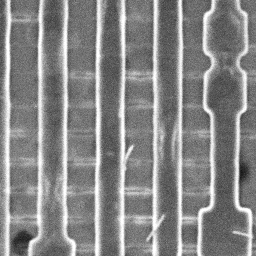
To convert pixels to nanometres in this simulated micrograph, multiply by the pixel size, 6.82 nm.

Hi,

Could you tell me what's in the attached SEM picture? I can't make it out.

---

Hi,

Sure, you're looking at wiring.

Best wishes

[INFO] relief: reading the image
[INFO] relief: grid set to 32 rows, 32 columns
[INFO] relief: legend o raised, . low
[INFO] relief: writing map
o....ooo....ooo....oooo....ooo..
o....ooo....ooo....oooo...oooo..
o....ooo....ooo....oooo...ooooo.
o....ooo....ooo....oooo...ooooo.
o....ooo....ooo....oooo...ooooo.
o....ooo....ooo....oooo...ooooo.
o....ooo....ooo....oooo...oooo..
o....ooo....ooo....oooo....ooo..
o....ooo....ooo....oooo....ooo..
o....ooo....ooo....oooo...oooo..
o....ooo....ooo....oooo...ooooo.
o....ooo....ooo....oooo...ooooo.
o....ooo....ooo.....ooo...ooooo.
o....ooo....ooo....oooo...ooooo.
o....ooo....ooo....oooo...oooo..
o....ooo....ooo....oooo...oooo..
o....ooo....ooo....oooo...oooo..
o....ooo....ooo....ooo....oooo..
o....ooo....ooo....ooo....oooo..
o....ooo....ooo.....oo....oooo..
o....ooo....ooo....ooo....oooo..
o....ooo....ooo....oooo....ooo..
o....ooo....ooo....oooo....ooo..
o....ooo....ooo....oooo....ooo..
o....ooo....ooo....oooo....ooo..
o....ooo....ooo....oooo...oooo..
o....ooo....ooo....oooo..oooooo.
o....ooo....ooo....oooo..oooooo.
o....ooo....ooo....oooo..oooooo.
o....ooo....ooo....oooo..oooooo.
o...ooooo...ooo....oooo..oooooo.
o...ooooo...ooo....oooo..oooooo.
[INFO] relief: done